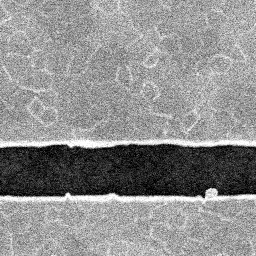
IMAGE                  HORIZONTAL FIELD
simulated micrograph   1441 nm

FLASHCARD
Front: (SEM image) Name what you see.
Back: one or a few lines or trenches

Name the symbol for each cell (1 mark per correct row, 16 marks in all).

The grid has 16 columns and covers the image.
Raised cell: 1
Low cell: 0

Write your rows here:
1111111111111111
1111111111111111
1111111111111111
1111111111111111
1111111111111111
1111111111111111
1111111111111111
1111111111111111
1111111111111111
0000000000000000
0000000000000000
0000000000000000
1111111111111111
1111111111111111
1111111111111111
1111111111111111